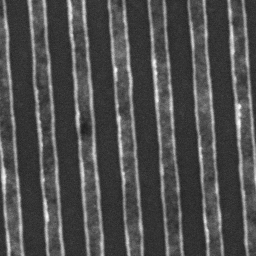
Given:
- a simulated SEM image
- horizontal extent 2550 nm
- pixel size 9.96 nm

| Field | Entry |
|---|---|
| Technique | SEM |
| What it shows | parallel lines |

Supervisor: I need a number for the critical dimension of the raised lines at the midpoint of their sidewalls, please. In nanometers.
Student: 158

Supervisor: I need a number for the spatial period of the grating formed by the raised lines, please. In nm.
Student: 396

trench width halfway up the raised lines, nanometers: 237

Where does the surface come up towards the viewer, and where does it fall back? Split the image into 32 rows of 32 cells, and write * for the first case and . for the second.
*...**...**...**...**...**...*..
*...**...**...**...**...**...**.
*...**...**...**...**...**...**.
*...**...**...**...**...**...**.
*...**...**...**...**...**...**.
*...**...**...**...**...**...**.
*...**...**...**...**...**...**.
*...**...**...**...**...**...**.
*...**...**...**...**...**...**.
*...**...**...**...**...**...**.
*...**...**...**...**...**...**.
*...**...**...**...**...**...**.
*....**..**...**...**...**...**.
**...**...**...*....*....*...**.
**...**...**...**...**...**...*.
**...**...**...**...**...**...**
**...**...**...**...**...**...**
**...**...**...**...**...**...**
**...**...**...**...**...**...**
**...**...**...**...**...**...**
**...**...**...**...**...**...**
**...**...**...**...**...**...**
**...**...**...**...**...**...**
**...**...**...**...**...**...**
**...**...**...**...**...**...**
.*....*...**...**...**...**...**
.**...*....*....**..***..**...**
.**...**...**...**...**...**...*
.**...**...**...**...**...**...*
.**...**...**...**...**...**...*
.**...**...**...**...**...**...*
.**...**...**...**...**...**...*